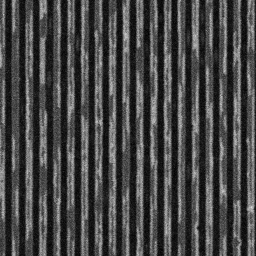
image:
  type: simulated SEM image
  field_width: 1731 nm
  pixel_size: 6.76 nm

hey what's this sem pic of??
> parallel lines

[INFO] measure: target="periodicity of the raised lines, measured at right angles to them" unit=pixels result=13.9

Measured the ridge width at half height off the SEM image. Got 0.0431 micrometres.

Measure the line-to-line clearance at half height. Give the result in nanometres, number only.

49.9